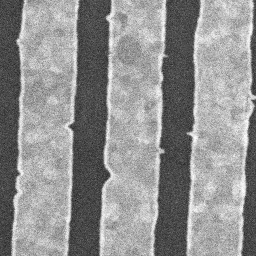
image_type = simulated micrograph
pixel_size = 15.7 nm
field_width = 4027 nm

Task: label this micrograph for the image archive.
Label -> one or a few lines or trenches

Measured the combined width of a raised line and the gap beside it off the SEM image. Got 1370 nanometres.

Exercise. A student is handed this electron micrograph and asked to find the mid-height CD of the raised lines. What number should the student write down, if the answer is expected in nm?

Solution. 825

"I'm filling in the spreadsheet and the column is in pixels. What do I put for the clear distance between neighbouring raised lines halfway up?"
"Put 34.7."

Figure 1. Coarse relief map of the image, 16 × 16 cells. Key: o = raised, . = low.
..ooo..ooo...ooo
.oooo..ooo..oooo
.oooo..ooo..oooo
.oooo..ooo..oooo
.oooo..ooo..oooo
.oooo..ooo..oooo
.oooo..ooo..oooo
.ooo...ooo..ooo.
.ooo...ooo..ooo.
.ooo...ooo..ooo.
.ooo...ooo..ooo.
.ooo...ooo..ooo.
.ooo..oooo..ooo.
.ooo..oooo..ooo.
.ooo..oooo..ooo.
.ooo..oooo..ooo.